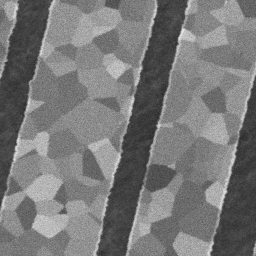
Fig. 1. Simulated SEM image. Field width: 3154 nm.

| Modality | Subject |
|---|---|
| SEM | one or a few lines or trenches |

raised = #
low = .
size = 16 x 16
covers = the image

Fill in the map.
#..#######..####
#..#######.#####
#..######..#####
..#######..#####
..#######..#####
..######...#####
..######..#####.
.#######..#####.
.#######..#####.
.#######.######.
.######..#####..
#######..#####..
#######..#####..
######..######..
######..#####...
######..#####...